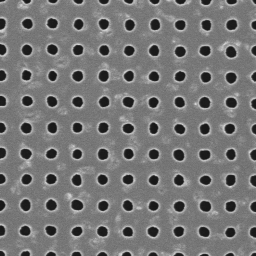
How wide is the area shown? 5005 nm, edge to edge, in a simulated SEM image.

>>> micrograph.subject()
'a regular array of holes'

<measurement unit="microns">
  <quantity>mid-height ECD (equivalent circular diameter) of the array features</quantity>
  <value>0.208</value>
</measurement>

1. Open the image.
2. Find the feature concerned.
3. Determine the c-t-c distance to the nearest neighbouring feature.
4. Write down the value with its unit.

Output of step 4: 492 nm